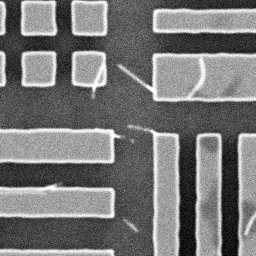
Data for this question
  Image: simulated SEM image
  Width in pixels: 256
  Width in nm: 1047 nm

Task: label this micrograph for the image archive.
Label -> groups of lines, slits or small figures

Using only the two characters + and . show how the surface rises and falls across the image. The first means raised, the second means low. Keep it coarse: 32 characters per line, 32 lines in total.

...++++..++++...................
+..++++..++++......+++++++++++++
+..++++..++++......+++++++++++++
+..++++..++++......+++++++++++++
................................
................................
...........+....................
+..++++..++++......+++++++++++++
+..++++..++++......+++++++++++++
+..++++..++++......+++++++++++++
...+++...++++......+++++++++++++
...................+++++++++++++
.....................+...+++....
................................
................................
................................
++++++++++++++..................
++++++++++++++.....+++...+++..++
++++++++++++++.....+++...+++..++
++++++++++++++.....+++...+++..++
...................+++...+++..++
...................+++...+++..++
...................+++...+++..++
+....++............+++...+++..++
++++++++++++++.....+++...+++..++
++++++++++++++.....+++...+++..++
++++++++++++++.....+++...+++..++
...................+++...+++..++
...................+++...+++..++
...................+++..++++..++
...................+++...+++..++
++++++++++++++.....+++...+++..++